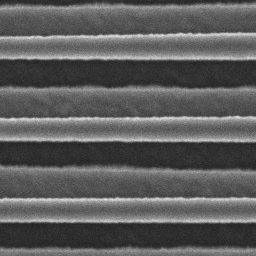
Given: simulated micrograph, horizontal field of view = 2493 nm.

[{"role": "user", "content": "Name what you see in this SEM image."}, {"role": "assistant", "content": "lines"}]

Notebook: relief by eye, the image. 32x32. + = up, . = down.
................................
++++++++++++++++++++++++++++++++
++++++++++++++++++++++++++++++++
++++++++++++++++++++++++++++++++
++++++++++++++++++++++++++++++++
++++++++++++++++++++++++++++++++
++++++++++++++++++++++++++++++++
................................
................................
................................
................................
++++++++++++++++++++++++++++++++
++++++++++++++++++++++++++++++++
++++++++++++++++++++++++++++++++
++++++++++++++++++++++++++++++++
++++++++++++++++++++++++++++++++
++++++++++++++++++++++++++++++++
++++++++++++++++++++++++++++++++
................................
................................
................................
++++++++++++++++++++++++++++++..
++++++++++++++++++++++++++++++++
++++++++++++++++++++++++++++++++
++++++++++++++++++++++++++++++++
++++++++++++++++++++++++++++++++
++++++++++++++++++++++++++++++++
++++++++++++++++++++++++++++++++
................................
................................
................................
++++++++++++++++++++++++++++++++